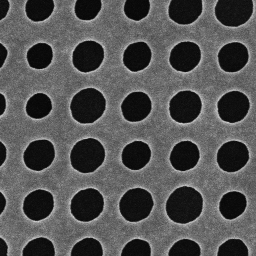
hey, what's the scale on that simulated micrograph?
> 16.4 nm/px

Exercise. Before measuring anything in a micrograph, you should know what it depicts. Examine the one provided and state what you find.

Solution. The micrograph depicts a regular array of holes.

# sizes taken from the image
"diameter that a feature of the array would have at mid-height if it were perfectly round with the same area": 518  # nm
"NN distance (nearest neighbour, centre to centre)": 792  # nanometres